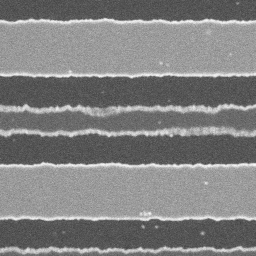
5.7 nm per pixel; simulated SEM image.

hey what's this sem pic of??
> lines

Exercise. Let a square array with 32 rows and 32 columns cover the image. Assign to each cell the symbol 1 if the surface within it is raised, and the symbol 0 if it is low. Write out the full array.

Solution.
00000000000000000000000000000000
00000000000000000000000000000000
00011100001111000001000001100000
11111111111111111111111111111111
11111111111111111111111111111111
11111111111111111111111111111111
11111111111111111111111111111111
11111111111111111111111111111111
11111111111111111111111111111111
00001101110110101100100000100000
00000000000000000000000000000000
00000000000000000000000000000000
00000000000000000000000000000000
00000000100000000100000000001101
11111111111111111111111111111111
11111111111111111111111111111111
11011111111011111111100100000111
00000000000000000000000000000000
00000000000000000000000000000000
00000000000000000000000000000000
00000110000011100001000000000011
11111111111111111111111111111111
11111111111111111111111111111111
11111111111111111111111111111111
11111111111111111111111111111111
11111111111111111111111111111111
11111111111111111111111111111111
00000110000110100110111000010001
00000000000000000000000000000000
00000000000000000000000000000000
00000000000000000000000000000000
11111111111111111111111111111111